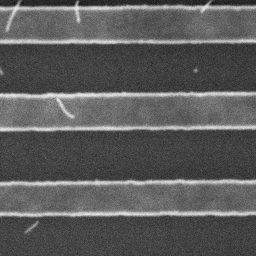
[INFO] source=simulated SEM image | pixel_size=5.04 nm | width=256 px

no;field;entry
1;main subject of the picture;lines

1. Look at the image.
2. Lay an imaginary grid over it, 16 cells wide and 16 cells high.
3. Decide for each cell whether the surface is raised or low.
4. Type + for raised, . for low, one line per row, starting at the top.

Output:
++++++++++++++++
++++++++++++++++
++++++++++++++++
................
................
................
++++++++++++++++
++++++++++++++++
................
................
................
++++++++++++++++
++++++++++++++++
.++.............
................
................